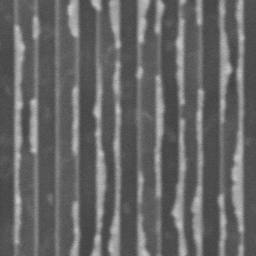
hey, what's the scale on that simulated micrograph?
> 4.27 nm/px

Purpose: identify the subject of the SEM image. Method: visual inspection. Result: parallel lines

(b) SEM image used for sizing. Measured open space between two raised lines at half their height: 78.4 nanometres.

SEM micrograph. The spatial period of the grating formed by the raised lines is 41.1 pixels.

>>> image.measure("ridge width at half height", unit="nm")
99.2